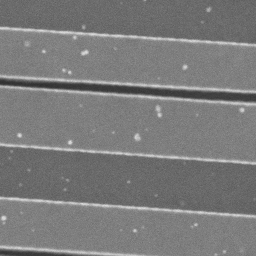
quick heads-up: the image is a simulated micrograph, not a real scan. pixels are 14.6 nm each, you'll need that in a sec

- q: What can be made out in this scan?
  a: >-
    lines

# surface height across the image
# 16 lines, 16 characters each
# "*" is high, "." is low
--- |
................
................
************....
****************
****************
*******.********
****************
****************
****************
......**********
................
................
**..............
****************
****************
****************